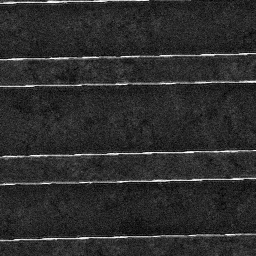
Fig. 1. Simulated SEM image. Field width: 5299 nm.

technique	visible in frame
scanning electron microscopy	lines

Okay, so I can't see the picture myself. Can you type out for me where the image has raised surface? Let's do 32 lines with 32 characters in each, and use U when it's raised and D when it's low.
DDDDDDDDDDDDDDDDDDDDDDDDDDDDDDDD
DDDDDDDDDDDDDDDDDDDDDDDDDDDDDDDD
DDDDDDDDDDDDDDDDDDDDDDDDDDDDDDDD
DDDDDDDDDDDDDDDDDDDDDDDDDDDDDDDD
DDDDDDDDDDDDDDDDDDDDDDDDDDDDDDDD
DDDDDDDDDDDDDDDDDDDDDDDDDDDDDDDD
DDDDDDDDDDDDDDDDDDDDDDDDDDDDDDDD
DUUUUUUUUUUUUUUUUUUUUUUUUUUUUUUU
UUUUUUUUUUUUUUUUUUUUUUUUUUUUUUUU
UUUUUUUUUUUUUUUUUUUUUUUUUUUUUUUU
UUUUUUUUUUUUUUUUDDDDDDDDDDDDDDDD
DDDDDDDDDDDDDDDDDDDDDDDDDDDDDDDD
DDDDDDDDDDDDDDDDDDDDDDDDDDDDDDDD
DDDDDDDDDDDDDDDDDDDDDDDDDDDDDDDD
DDDDDDDDDDDDDDDDDDDDDDDDDDDDDDDD
DDDDDDDDDDDDDDDDDDDDDDDDDDDDDDDD
DDDDDDDDDDDDDDDDDDDDDDDDDDDDDDDD
DDDDDDDDDDDDDDDDDDDDDDDDDDDDDDDD
DDDDDDDDDDDDDDDDDDDDDDDDDDDDDDDD
DDDDUUUUUUUUUUUUUUUUUUUUUUUUUUUU
UUUUUUUUUUUUUUUUUUUUUUUUUUUUUUUU
UUUUUUUUUUUUUUUUUUUUUUUUUUUUUUUU
UUUUUUUUUUUUUUUUUUUUUUUUUDDDDDDD
DDDDDDDDDDDDDDDDDDDDDDDDDDDDDDDD
DDDDDDDDDDDDDDDDDDDDDDDDDDDDDDDD
DDDDDDDDDDDDDDDDDDDDDDDDDDDDDDDD
DDDDDDDDDDDDDDDDDDDDDDDDDDDDDDDD
DDDDDDDDDDDDDDDDDDDDDDDDDDDDDDDD
DDDDDDDDDDDDDDDDDDDDDDDDDDDDDDDD
DDDDDDDDDDDDDDDDDDDDDDDDUUUUUUUU
UUUUUUUUUUUUUUUUUUUUUUUUUUUUUUUU
UUUUUUUUUUUUUUUUUUUUUUUUUUUUUUUU